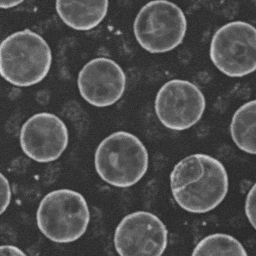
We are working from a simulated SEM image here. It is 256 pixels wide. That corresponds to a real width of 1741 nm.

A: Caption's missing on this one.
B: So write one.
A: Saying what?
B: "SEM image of raised bodies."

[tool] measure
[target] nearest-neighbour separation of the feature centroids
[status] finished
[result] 544 nm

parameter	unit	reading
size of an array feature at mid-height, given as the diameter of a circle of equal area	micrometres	0.324